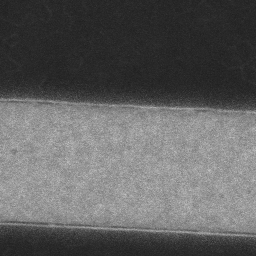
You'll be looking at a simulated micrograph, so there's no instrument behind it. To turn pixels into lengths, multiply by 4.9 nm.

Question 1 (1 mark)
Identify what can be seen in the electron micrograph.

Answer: one or a few lines or trenches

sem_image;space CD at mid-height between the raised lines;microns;0.601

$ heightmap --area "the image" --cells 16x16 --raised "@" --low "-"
@@@@@@@@@@@@@@@@
@@@@@@@@@@@@@@@@
@@@@@@@@@@@@@@@@
@@@@@@@@@@@@@@@@
@@@@@@@@@@@@@@@@
@@@@@@@@@@@@@@@@
-----@@@@@@@@@@@
----------------
----------------
----------------
----------------
----------------
----------------
----------------
@@@@@@@@@@@@----
@@@@@@@@@@@@@@@@